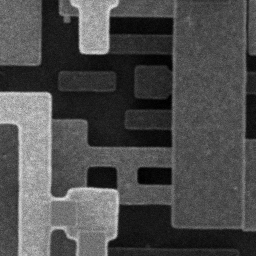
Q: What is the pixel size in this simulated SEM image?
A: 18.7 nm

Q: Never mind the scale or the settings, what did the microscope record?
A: wiring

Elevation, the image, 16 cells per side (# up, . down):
.....##....####.
.....##....####.
.....##....####.
...........####.
...........####.
...........####.
###........####.
###........####.
.##........####.
.##........####.
.##........####.
.##........####.
.######....####.
.######....####.
.##.###.........
.##..##.........